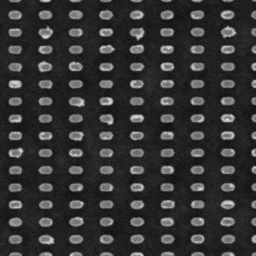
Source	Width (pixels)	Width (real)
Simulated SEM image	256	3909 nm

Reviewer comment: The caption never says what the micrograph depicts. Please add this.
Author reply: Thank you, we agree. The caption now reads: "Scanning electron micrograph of a regular array of raised bodies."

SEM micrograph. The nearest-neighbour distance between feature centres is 260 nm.